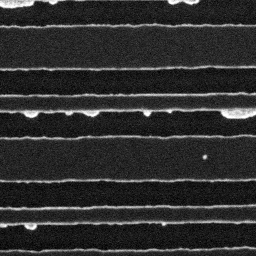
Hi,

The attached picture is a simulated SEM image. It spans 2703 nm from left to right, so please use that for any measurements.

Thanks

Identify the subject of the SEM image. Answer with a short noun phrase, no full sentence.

lines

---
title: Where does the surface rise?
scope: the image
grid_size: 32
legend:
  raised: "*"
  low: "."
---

***.............................
................................
................................
********************************
********************************
********************************
********************************
********************************
**********************.**.......
................................
................................
................................
********************************
********************************
............................***.
................................
................................
********************************
********************************
********************************
********************************
********************************
***********************.*******.
................................
................................
................................
********************************
********************************
................................
................................
................................
********************************